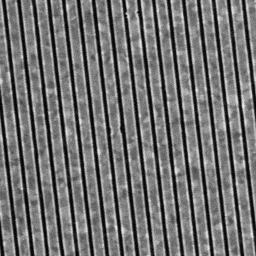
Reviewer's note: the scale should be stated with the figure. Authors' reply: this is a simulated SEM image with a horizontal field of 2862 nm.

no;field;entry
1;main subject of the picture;parallel lines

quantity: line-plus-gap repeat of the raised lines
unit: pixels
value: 14.9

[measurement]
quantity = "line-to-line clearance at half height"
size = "55.6 nanometres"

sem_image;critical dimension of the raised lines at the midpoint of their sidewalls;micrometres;0.111